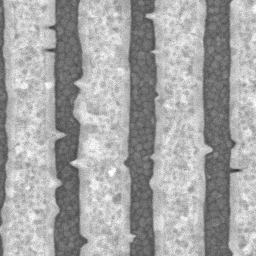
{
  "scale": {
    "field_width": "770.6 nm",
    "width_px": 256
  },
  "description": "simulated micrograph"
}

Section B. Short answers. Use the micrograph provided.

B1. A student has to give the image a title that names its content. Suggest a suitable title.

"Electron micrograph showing one or a few lines or trenches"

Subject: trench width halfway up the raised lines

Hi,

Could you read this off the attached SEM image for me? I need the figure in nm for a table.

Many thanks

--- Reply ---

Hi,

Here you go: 106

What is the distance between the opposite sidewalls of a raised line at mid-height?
40.2 px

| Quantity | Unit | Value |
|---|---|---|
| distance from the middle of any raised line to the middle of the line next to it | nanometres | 225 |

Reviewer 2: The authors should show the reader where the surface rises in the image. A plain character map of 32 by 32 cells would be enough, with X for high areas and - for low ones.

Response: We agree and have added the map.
-XXXXX----XXXXXX----XXXXX----XXX
-XXXXX----XXXXXX----XXXXX----XXX
-XXXXX----XXXXXX----XXXXX----XXX
-XXXXX----XXXXXX----XXXXX----XXX
-XXXXX-----XXXXX----XXXXX----XXX
-XXXXX-----XXXXX----XXXXX-----XX
-XXXXX-----XXXX-----XXXXX----XXX
-XXXXX-----XXXX-----XXXXX-----XX
-XXXXX-----XXXXX----XXXXX----XXX
-XXXXX-----XXXXX----XXXXX----XXX
-XXXXX----XXXXXX----XXXXX----XXX
--XXXX-----XXXXX----XXXXX----XXX
--XXXX----XXXXXX----XXXXX----XXX
--XXXX----XXXXXX----XXXXX----XXX
--XXXX----XXXXXX----XXXXX----XXX
-XXXXX-----XXXX-----XXXXX----XXX
-XXXXXX----XXXX-----XXXXX----XXX
-XXXXXX----XXXX-----XXXXX-----XX
-XXXXX----XXXXX-----XXXXX-----XX
--XXXX----XXXXX-----XXXXX----XXX
-XXXXX---XXXXXX-----XXXXX----XXX
-XXXXX----XXXXXX----XXXXX-----XX
-XXXXXX----XXXXX----XXXXX----XXX
-XXXXXX----XXXXX----XXXXX----XXX
-XXXXX-----XXXXX----XXXXX----XXX
-XXXXX-----XXXXX----XXXXX----XXX
-XXXXXX----XXXXX----XXXXX----XXX
-XXXXX-----XXXXX----XXXXX----XXX
-XXXXX-----XXXXX----XXXXX----XXX
-XXXXX-----XXXXX----XXXXX----XXX
-XXXXX-----XXXXX----XXXXX----XXX
-XXXXX-----XXXXX----XXXXX-----XX